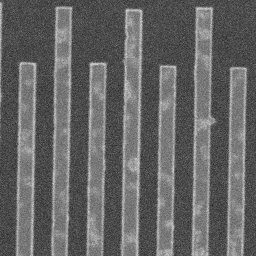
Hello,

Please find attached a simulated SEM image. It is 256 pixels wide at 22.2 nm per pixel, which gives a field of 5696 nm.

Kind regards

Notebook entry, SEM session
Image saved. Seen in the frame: parallel lines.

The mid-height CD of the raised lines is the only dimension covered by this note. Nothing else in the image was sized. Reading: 0.311 microns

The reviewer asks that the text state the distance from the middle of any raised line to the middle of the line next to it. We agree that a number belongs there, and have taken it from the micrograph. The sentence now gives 782 nm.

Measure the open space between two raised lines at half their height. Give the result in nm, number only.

456